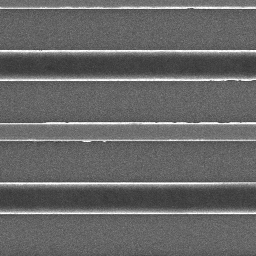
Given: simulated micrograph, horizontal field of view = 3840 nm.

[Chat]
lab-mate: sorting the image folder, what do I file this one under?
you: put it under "lines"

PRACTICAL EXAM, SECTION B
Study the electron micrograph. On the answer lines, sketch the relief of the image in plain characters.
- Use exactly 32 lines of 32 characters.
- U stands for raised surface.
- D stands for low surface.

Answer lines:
UUUUUUUUUUUUUUUUUUUUUUUUUUUUUUUU
DDDDDDDDDDDDDDDDDDDDDDDDDDDDDDDD
DDDDDDDDDDDDDDDDDDDDDDDDDDDDDDDD
DDDDDDDDDDDDDDDDDDDDDDDDDDDDDDDD
DDDDDDDDDDDDDDDDDDDDDDDDDDDDDDDD
DDDDDDDDDDDDDDDDDDDDDDDDDDDDDDDD
UUUUUUUUUUUUUUUUUUUUUUUUUUUUUUUU
UUUUUUUUUUUUUUUUUUUUUUUUUUUUUUUU
UUUUUUUUUUUUUUUUUUUUUUUUUUUUUUUU
UUUUUUUUUUUUUUUUUUUUUUUUUUUUUUUU
DDDDDDDDDDDDDDDDDDDDDDDDDDDDDDDD
DDDDDDDDDDDDDDDDDDDDDDDDDDDDDDDD
DDDDDDDDDDDDDDDDDDDDDDDDDDDDDDDD
DDDDDDDDDDDDDDDDDDDDDDDDDDDDDDDD
DDDDDDDDDDDDDDDDDDDDDDDDDDDDDDDD
UUUUUUUUUUUUUUUUUUUUUUUUUUUUUUUU
UUUUUUUUUUUUUUUUUUUUUUUUUUUUUUUU
UUUUUUUUUUUUUUUUUUUUUUUUUUUUUUUU
DDDDDDDDDDDDDDDDDDDDDDDDDDDDDDDD
DDDDDDDDDDDDDDDDDDDDDDDDDDDDDDDD
DDDDDDDDDDDDDDDDDDDDDDDDDDDDDDDD
DDDDDDDDDDDDDDDDDDDDDDDDDDDDDDDD
DDDDDDDDDDDDDDDDDDDDDDDDDDDDDDDD
UUUUUUUUUUUUUUUUUUUUUUUUUUUUUUUU
UUUUUUUUUUUUUUUUUUUUUUUUUUUUUUUU
UUUUUUUUUUUUUUUUUUUUUUUUUUUUUUUU
UUUUUUUUUUUUUUUUUUUUUUUUUUUUUUUU
DDDDDDDDDDDDDDDDDDDDDDDDDDDDDDDD
DDDDDDDDDDDDDDDDDDDDDDDDDDDDDDDD
DDDDDDDDDDDDDDDDDDDDDDDDDDDDDDDD
DDDDDDDDDDDDDDDDDDDDDDDDDDDDDDDD
DDDDDDDDDDDDDDDDDDDDDDDDDDDDDDDD